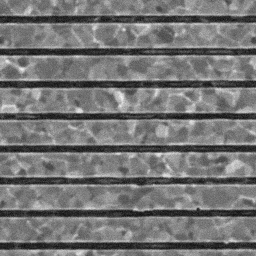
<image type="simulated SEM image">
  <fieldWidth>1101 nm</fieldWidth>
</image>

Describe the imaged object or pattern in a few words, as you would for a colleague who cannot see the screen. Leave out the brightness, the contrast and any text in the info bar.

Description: parallel lines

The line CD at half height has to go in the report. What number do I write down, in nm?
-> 103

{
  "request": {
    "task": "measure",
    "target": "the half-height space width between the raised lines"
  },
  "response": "34.4 nm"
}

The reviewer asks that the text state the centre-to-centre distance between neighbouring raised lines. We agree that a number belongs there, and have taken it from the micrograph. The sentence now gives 139 nm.